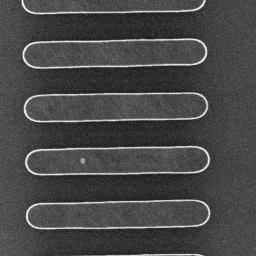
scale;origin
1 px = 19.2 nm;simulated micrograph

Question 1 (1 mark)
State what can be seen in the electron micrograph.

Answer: groups of lines, slits or small figures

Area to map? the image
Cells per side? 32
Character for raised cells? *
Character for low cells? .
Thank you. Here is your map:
...**********************.......
....************................
................................
................................
................................
....*********************.......
...***********************......
...**********************.......
................................
................................
................................
................................
....**********************......
...***********************......
...**********************.......
................................
................................
................................
..............***********.......
....**********************......
...***********************......
....*********************.......
................................
................................
................................
.....*********************......
...***********************......
...***********************......
.....***...**...................
................................
................................
................................